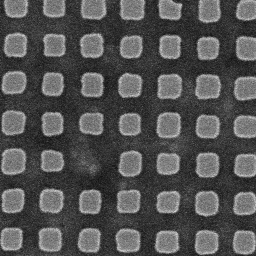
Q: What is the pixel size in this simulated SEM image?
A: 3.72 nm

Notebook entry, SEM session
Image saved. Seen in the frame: a regular array of raised bodies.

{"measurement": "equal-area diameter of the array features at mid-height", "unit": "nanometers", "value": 90.3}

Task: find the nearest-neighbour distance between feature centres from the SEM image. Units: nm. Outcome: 142